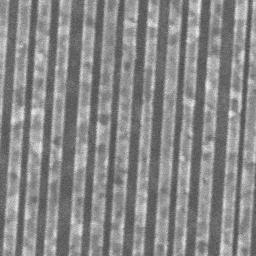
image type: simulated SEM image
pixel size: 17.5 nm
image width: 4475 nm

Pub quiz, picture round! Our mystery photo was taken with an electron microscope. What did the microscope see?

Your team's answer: parallel lines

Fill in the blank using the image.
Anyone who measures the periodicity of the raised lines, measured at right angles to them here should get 21.5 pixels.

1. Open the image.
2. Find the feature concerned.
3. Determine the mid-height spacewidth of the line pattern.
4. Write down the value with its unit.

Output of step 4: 183 nm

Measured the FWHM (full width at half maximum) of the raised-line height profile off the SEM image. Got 183 nm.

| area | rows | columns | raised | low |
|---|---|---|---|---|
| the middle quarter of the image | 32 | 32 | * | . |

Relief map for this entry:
....***...**...**...**....**...*
....***..***..***...**....**...*
....***..***..***...**....**..**
....***..***..***...**....**..**
....***..***..***...**....**..**
....***..***..***...**...***..**
....***..***..***...**...***..**
....**...***..***...**...***..**
....**...***..***...**...***..**
....**...***..***...**...***..**
....**...**...***...**...***..**
....**...**...***...**...***..**
....**...**...**....**...**...**
....**...**...**...***...**...**
....**...**...***...**...**...**
....**...**...***..***...**...**
...***...**...**...**....**...**
...***..***..***...**....**...**
...***..***..***...**....**..***
...***..***..***...**....**..***
...***..***..***...**....**..***
...***..***..***...**...***..**.
...***..***..***...**...***..**.
...**...***..***...**...***..***
...**...***..***...**...***..**.
...**...***..***...**...***..**.
...**...***..***...**...***..**.
...**...**...***...**...***..**.
...**...**...**....**...**...**.
...**...**...**...***...**...**.
...**...**...**...***...**...**.
...**...**...**....**...**...**.